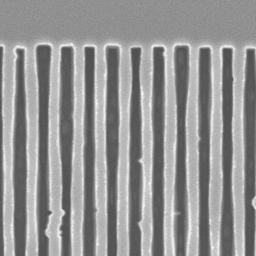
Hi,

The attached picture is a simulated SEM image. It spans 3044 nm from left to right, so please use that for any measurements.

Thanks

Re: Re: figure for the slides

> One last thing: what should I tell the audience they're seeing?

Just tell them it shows parallel lines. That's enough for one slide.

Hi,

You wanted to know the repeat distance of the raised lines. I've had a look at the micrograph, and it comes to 274 nm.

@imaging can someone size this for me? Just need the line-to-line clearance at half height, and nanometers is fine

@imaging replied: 132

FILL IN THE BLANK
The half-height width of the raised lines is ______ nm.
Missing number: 141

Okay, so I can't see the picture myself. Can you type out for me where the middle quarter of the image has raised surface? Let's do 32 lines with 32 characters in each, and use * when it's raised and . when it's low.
..***...***...***..***...**....*
..***...***...***..***...**....*
..***...***...***..***...***...*
..***...***...***..***...***...*
..***...***...***..***...***...*
..***...***...***..***...***...*
...**...***...***..***...***...*
..***...***...***..***...***...*
..***...***...***..***...***...*
..***...**....**...***...***...*
...**...**....**...***...***...*
..***...**....**...***...***...*
..***...**....**...***...***...*
..***...**....**...***...***...*
..***...**....**...***...***...*
...**...**....**...***...***...*
...**...**....**...***...***...*
...**...**....**...***...***...*
..***...**....**...***...***...*
..***...**....**...***...***...*
..***...**....**...***...***...*
..***...**....**...***...***...*
..***...**....**...***...***...*
..***...**....**...***...***...*
..***...**....**...***...***...*
..***...***..***...***...***...*
..***...***..***....**...***...*
..***...***..***....**...***...*
..***...***..***....**...***...*
..***...***..***....**...***...*
..***...***..***....**...***...*
..***...***..***....**...**....*